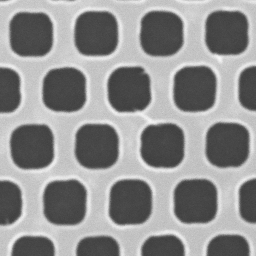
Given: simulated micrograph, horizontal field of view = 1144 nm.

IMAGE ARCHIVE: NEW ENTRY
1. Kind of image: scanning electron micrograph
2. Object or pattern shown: a regular array of holes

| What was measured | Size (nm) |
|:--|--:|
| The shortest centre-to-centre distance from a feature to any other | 289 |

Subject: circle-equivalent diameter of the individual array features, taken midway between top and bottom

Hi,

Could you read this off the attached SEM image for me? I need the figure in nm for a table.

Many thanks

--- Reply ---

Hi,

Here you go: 213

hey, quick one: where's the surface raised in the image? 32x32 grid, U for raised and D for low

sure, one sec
UUUUUUUUUUUUUUUUUUUUUUUUUUUUUUUU
UUUDDUUUUUUDDDUUUUUDDUUUUUUDDDUU
UDDDDDUUUUDDDDDUUUDDDDDUUUDDDDDU
UDDDDDDUUDDDDDDUUDDDDDDUUUDDDDDU
UDDDDDDUUDDDDDDUUDDDDDDUUUDDDDDU
UDDDDDDUUDDDDDDUUDDDDDDUUUDDDDDU
UUDDDDUUUUDDDDUUUUDDDDUUUUDDDDUU
UUUUUUUUUUUUUUUUUUUUUUUUUUUUUUUU
DUUUUUUUDDUUUUUDDDUUUUUDDDUUUUUD
DDUUUUDDDDDUUUDDDDDUUUDDDDDUUUDD
DDDUUDDDDDDUUDDDDDDUUUDDDDDUUUDD
DDDUUDDDDDDUUDDDDDDUUUDDDDDUUUDD
DDDUUDDDDDDUUDDDDDDUUUDDDDDUUUDD
DDUUUUDDDDUUUUDDDDUUUUDDDDUUUUUD
UUUUUUUUUUUUUUUUUUUUUUUUUUUUUUUU
UUUUDUUUUUUDDUUUUUUUDDUUUUUDDDUU
UUDDDDDUUDDDDDDUUUDDDDDUUUDDDDDU
UDDDDDDUUDDDDDDUUDDDDDDUUUDDDDDU
UDDDDDDUUDDDDDDUUDDDDDDUUUDDDDDU
UDDDDDDUUDDDDDDUUUDDDDDUUUDDDDDU
UUDDDDUUUUDDDDUUUUDDDDUUUUDDDDUU
UUUUUUUUUUUUUUUUUUUUUUUUUUUUUUUU
UUUUUUUUUDUUUUUDDDUUUUUDDDUUUUUD
DDUUUUDDDDDUUUDDDDDUUUDDDDDUUUDD
DDDUUDDDDDDUUUDDDDDUUUDDDDDUUUDD
DDDUUDDDDDDUUUDDDDDUUUDDDDDUUUDD
DDDUUDDDDDDUUUDDDDDUUUDDDDDUUUDD
DDUUUUDDDDUUUUDDDDUUUUDDDDDUUUDD
UUUUUUUUUUUUUUUUUUUUUUUUUUUUUUUU
UUUDDUUUUUUUUUUUUUUDDDUUUUUDDDUU
UUDDDDDUUUDDDDDUUUDDDDDUUUDDDDDU
UDDDDDDUUDDDDDDUUUDDDDDUUUDDDDDU